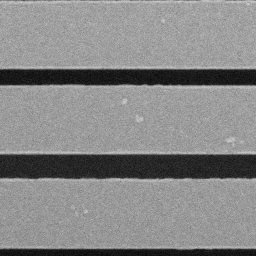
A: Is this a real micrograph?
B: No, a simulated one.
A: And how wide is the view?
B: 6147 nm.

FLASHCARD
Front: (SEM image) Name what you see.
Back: lines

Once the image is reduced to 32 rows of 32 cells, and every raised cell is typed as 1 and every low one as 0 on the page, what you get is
11111111111111111111111111111111
11111111111111111111111111111111
11111111111111111111111111111111
11111111111111111111111111111111
11111111111111111111111111111111
11111111111111111111111111111111
11111111111111111111111111111111
11111111111111111111111111111111
11111111111111111111111111111111
00000000000000000000000000000000
00000000000000000000000000000000
11111111111111111111111111111111
11111111111111111111111111111111
11111111111111111111111111111111
11111111111111111111111111111111
11111111111111111111111111111111
11111111111111111111111111111111
11111111111111111111111111111111
11111111111111111111111111111111
00000000000000000000000000000000
00000000000000000000000000000000
00000000000000000000000000000000
11111111111111111111111111111111
11111111111111111111111111111111
11111111111111111111111111111111
11111111111111111111111111111111
11111111111111111111111111111111
11111111111111111111111111111111
11111111111111111111111111111111
11111111111111111111111111111111
11111111111111111111111111111111
00000000000000000000000000000000